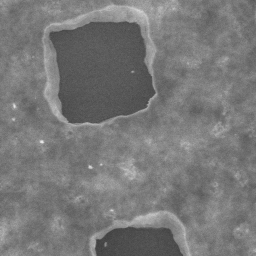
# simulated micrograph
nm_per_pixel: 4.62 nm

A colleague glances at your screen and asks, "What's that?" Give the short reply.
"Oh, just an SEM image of holes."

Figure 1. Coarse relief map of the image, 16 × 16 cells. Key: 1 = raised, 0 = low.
1111111111111111
1111100001111111
1110000001111111
1110000001111111
1110000001111111
1110000000111111
1111000001111111
1111000111111111
1111111111111111
1111111111111111
1111111111111111
1111111111111111
1111111111111111
1111111111111111
1111111000011111
1111110000011111